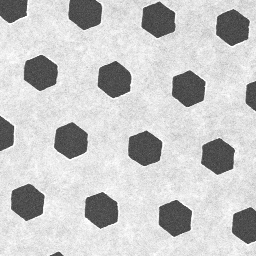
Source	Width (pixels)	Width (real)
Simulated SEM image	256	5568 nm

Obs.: a regular array of holes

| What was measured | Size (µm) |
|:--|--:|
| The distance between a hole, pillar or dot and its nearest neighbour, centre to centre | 1.61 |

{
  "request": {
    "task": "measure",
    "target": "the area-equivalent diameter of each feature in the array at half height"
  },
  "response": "750 nm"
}